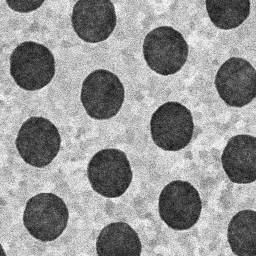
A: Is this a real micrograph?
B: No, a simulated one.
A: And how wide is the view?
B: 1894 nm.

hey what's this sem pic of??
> a regular array of holes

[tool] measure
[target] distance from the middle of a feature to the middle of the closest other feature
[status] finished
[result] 564 nanometres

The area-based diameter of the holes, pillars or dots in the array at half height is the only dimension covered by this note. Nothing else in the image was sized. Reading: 348 nm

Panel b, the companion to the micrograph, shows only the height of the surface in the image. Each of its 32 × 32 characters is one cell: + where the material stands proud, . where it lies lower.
+....++++.....++++++++++++.....+
++..+++++.....++++++++++++.....+
+++++++++......+++++++++++.....+
+++++++++.....++++++..+++++..+++
++++++++++....++++.....+++++++++
+++..+++++++++++++.....+++++++++
++....++++++++++++......++++++++
+......+++++++++++.....+++++...+
+......++++++++++++....++++.....
+......++++....++++++++++++.....
++....++++.....++++++++++++.....
++++++++++......+++++++++++.....
++++++++++.....+++++++++++++....
+++++++++++....+++++...+++++++++
+++++++++++...+++++.....++++++++
+++....++++++++++++.....++++++++
++.....++++++++++++.....++++++++
++......+++++++++++.....+++++...
++......++++++++++++...+++++....
+++....+++++....++++++++++++....
++++..+++++.....++++++++++++....
+++++++++++.....++++++++++++....
+++++++++++.....+++++++++++++...
++++++++++++....++++....++++++++
++++...++++++..+++++.....+++++++
+++.....++++++++++++.....+++++++
+++......+++++++++++.....+++++..
+++.....++++++++++++.....++++...
+++.....+++++....++++...++++....
++++...+++++.....+++++++++++....
++++++++++++......+++++++++++...
.+++++++++++......+++++++++++...